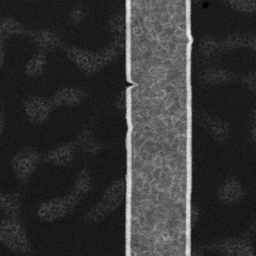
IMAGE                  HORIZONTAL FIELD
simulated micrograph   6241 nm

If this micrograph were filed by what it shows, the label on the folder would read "one or a few lines or trenches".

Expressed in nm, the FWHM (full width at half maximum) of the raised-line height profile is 1470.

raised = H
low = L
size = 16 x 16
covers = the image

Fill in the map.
LLLLLLLLHHHHLLLL
LLLLLLLLHHHHLLLL
LLLLLLLLHHHHLLLL
LLLLLLLLHHHHLLLL
LLLLLLLLHHHHLLLL
LLLLLLLLHHHHLLLL
LLLLLLLLHHHHLLLL
LLLLLLLLHHHHLLLL
LLLLLLLLHHHHLLLL
LLLLLLLLHHHHLLLL
LLLLLLLLHHHHLLLL
LLLLLLLLHHHHLLLL
LLLLLLLLHHHHLLLL
LLLLLLLLHHHHLLLL
LLLLLLLLHHHHLLLL
LLLLLLLLHHHHLLLL